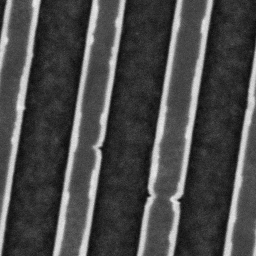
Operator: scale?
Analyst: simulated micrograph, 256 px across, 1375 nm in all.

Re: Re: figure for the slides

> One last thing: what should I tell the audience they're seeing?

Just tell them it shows one or a few lines or trenches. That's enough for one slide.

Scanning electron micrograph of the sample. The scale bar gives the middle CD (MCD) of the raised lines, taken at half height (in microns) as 0.154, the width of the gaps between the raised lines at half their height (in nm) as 295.